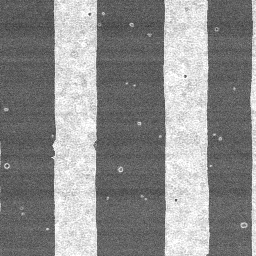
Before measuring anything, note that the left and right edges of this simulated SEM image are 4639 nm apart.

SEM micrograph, one or a few lines or trenches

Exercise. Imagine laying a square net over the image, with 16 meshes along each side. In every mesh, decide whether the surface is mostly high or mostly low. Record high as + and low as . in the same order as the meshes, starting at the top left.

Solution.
...+++....+++...
...+++....+++...
...+++....+++...
...+++....+++...
...+++....+++...
...+++....+++...
...+++....+++...
...+++....+++...
...+++....+++...
...+++....+++...
...+++....+++...
...+++....+++...
...+++....+++...
...+++....+++...
...+++....+++...
...+++....+++...